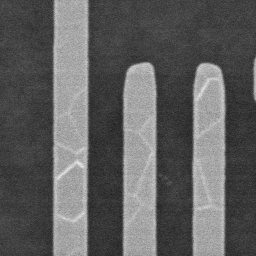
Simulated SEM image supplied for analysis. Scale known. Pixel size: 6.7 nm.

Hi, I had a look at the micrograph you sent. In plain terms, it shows wiring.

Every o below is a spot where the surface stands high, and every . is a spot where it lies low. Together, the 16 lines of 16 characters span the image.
...oo...........
...oo...........
...oo...........
...oo...........
...oo...oo..oo..
...oo...oo..oo..
...oo...oo..oo..
...oo...oo..oo..
...oo...oo..oo..
...oo...oo..oo..
...oo...oo..oo..
...oo...oo..oo..
...oo...oo..oo..
...oo...oo..oo..
...oo...oo..oo..
...oo...oo..oo..